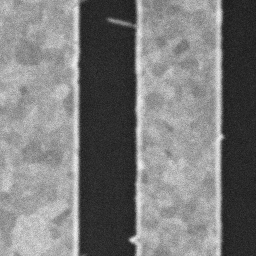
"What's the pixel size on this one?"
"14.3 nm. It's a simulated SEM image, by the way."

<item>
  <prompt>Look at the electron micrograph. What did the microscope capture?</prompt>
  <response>one or a few lines or trenches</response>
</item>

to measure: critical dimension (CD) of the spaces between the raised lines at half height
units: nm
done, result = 897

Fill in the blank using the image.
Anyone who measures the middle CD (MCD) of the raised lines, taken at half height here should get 1130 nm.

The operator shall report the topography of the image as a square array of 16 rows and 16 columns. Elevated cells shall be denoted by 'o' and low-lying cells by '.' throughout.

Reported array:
ooooo....ooooo..
ooooo....ooooo..
ooooo....ooooo..
ooooo....ooooo..
ooooo....ooooo..
ooooo....ooooo..
ooooo....ooooo..
ooooo....ooooo..
ooooo....ooooo..
ooooo....ooooo..
ooooo....ooooo..
ooooo....ooooo..
ooooo....ooooo..
ooooo....ooooo..
ooooo....ooooo..
ooooo....ooooo..